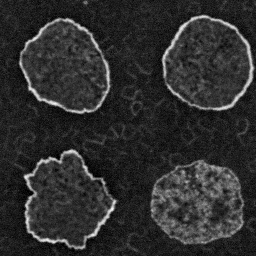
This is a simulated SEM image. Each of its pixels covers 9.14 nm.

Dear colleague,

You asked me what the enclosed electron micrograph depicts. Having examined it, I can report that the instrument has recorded raised bodies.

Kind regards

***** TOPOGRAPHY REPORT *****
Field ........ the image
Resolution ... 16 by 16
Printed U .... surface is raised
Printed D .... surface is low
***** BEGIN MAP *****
DDDDDDDDDDDDDDDD
DDDUUDDDDDDDUUDD
DDUUUUDDDDDUUUUD
DUUUUUDDDDUUUUUU
DUUUUUUDDDUUUUUU
DDUUUUUDDDDUUUUD
DDDUUUDDDDDDUUDD
DDDDDDDDDDDDDDDD
DDDDDDDDDDDDDDDD
DDDDDDDDDDDDDDDD
DDUUUDDDDDDDDDDD
DDUUUUDDDDDDDDDD
DDUUUUUDDDDDDDDD
DDUUUUUDDDDDDDDD
DDUUUUDDDDDDDDDD
DDDDDDDDDDDDDDDD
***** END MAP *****